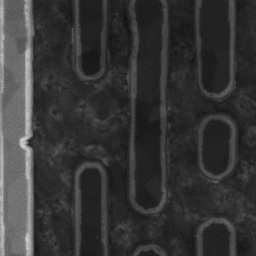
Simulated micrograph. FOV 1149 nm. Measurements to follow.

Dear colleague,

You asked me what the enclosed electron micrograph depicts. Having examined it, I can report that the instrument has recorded one or a few lines or trenches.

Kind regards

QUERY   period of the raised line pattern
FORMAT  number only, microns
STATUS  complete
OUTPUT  0.286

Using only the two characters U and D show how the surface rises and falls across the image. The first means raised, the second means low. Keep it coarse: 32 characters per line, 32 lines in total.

UUUUDDDDDDUUUDDDUUUUUDDDDUUUUDDD
UUUUDDDDDDUUUDDDUUUUUDDDDUUUUDDD
UUUUDDDDDDUUUDDDUUUUUDDDDUUUUDDD
UUUUDDDDDDUUUDDDDUUUUDDDDUUUUDDD
UUUUDDDDDDUUUDDDDUUUUDDDDUUUUDDD
UUUUDDDDDDUUUDDDDUUUUDDDDUUUUDDD
UUUUDDDDDDUUUDDDDUUUUDDDDUUUUDDD
UUUUDDDDDDUUUDDDDUUUUDDDDUUUUDDD
UUUUDDDDDDUUUDDDDUUUUDDDDUUUUDDD
UUUUDDDDDDUUDDDDDUUUUDDDDUUUUDDD
UUUUDDDDDDDDDDDDDUUUDDDDDUUUUDDD
UUUUDDDDDDDDDDDDDUUUDDDDDDUUDDDD
UUUUDDDDDDDDDDDDDUUUDDDDDDDDDDDD
UUUUDDDDDDDDDDDDDUUUUDDDDDDDDDDD
UUUUDDDDDDDDDDDDDUUUUDDDDDDDDDDD
UUUUDDDDDDDDDDDDDUUUUDDDDUUUUDDD
UUUUDDDDDDDDDDDDDUUUUDDDDUUUUDDD
UUUDDDDDDDDDDDDDDUUUUDDDDUUUUDDD
UUUDDDDDDDDDDDDDDUUUUDDDDUUUUDDD
UUUUDDDDDDDDDDDDUUUUDDDDDUUUUDDD
UUUUDDDDDDDDDDDDUUUUUDDDDUUUUDDD
UUUUDDDDDDUUUDDDUUUUDDDDDDUUDDDD
UUUUDDDDDDUUUDDDUUUUUDDDDDDDDDDD
UUUUDDDDDDUUUDDDUUUUUDDDDDDDDDDD
UUUUDDDDDDUUUDDDUUUUUDDDDDDDDDDD
UUUUDDDDDDUUUDDDDUUUDDDDDDDDDDDD
UUUUDDDDDDUUUDDDDDUDDDDDDDDDDDDD
UUUUDDDDDDUUUDDDDDDDDDDDDDUUDDDD
UUUUDDDDDDUUUDDDDDDDDDDDDUUUUDDD
UUUUDDDDDDUUUDDDDDDDDDDDDUUUUDDD
UUUUDDDDDDUUUDDDDDDDDDDDDUUUUDDD
UUUUDDDDDDUUUDDDDUUUDDDDDUUUUDDD